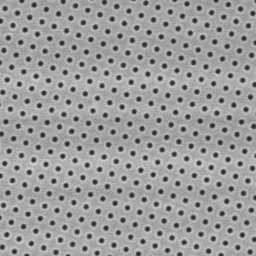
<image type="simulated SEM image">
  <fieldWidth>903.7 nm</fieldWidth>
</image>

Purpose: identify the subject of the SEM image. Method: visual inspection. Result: a regular array of holes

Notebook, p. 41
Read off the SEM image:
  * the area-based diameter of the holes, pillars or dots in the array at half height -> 0.0191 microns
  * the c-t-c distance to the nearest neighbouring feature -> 45.5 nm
